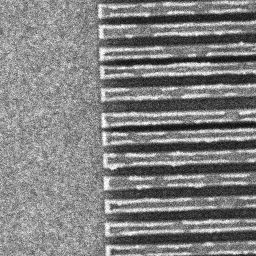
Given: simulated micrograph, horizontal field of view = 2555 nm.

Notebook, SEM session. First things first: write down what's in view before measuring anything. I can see parallel lines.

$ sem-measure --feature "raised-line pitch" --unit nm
218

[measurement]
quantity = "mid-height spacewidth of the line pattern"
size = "104 nm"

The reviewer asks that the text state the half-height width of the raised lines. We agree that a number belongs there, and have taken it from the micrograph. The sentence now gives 121 nm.